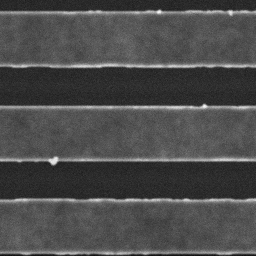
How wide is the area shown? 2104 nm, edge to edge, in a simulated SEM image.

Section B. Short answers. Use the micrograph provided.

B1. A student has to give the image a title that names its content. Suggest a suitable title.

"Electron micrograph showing lines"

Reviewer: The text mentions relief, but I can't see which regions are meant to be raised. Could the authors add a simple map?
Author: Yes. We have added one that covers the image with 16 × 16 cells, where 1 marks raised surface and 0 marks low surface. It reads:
0000000000000000
1111111111111111
1111111111111111
1111111111111111
0000000000000000
0000000000000000
0000000000000000
1111111111111111
1111111111111111
1111111111111111
0000000000000000
0000000000000000
0111111111110111
1111111111111111
1111111111111111
1111111111111111